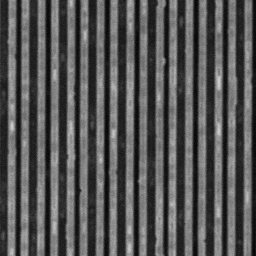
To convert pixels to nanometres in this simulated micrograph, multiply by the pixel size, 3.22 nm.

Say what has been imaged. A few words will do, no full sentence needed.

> parallel lines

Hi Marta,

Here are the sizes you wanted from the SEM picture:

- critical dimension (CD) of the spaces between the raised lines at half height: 24.9 nm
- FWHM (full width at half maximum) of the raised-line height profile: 6.74 pixels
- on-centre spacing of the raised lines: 47.5 nanometres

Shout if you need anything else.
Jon